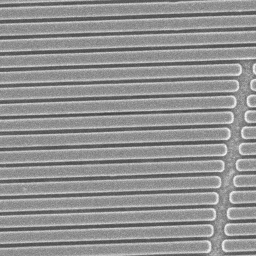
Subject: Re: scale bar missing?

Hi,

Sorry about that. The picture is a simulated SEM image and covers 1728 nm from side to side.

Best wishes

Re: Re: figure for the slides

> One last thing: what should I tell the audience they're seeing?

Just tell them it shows parallel lines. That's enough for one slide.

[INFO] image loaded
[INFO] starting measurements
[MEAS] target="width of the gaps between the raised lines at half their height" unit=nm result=27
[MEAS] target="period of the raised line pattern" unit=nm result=108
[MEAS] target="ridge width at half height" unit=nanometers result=80.1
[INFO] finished